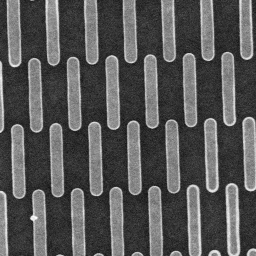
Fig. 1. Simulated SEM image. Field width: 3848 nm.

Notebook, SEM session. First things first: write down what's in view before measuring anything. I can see groups of lines, slits or small figures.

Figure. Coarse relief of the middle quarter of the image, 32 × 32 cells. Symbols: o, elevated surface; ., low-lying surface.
.ooo.......oo.......ooo.......oo
.ooo.......oo.......ooo.......oo
.ooo.......oo.......ooo.......oo
.ooo.......ooo......ooo.......oo
.ooo.......ooo......ooo.......oo
.ooo.......ooo......ooo.......oo
.ooo.......ooo......ooo.......oo
.ooo.......ooo......ooo.......oo
.ooo.......ooo......ooo.......oo
.ooo.......ooo......ooo.......oo
.ooo.......ooo......ooo.......oo
.ooo.......ooo.......oo.......oo
.ooo.......ooo.......oo.......oo
.ooo.......ooo.......ooo......oo
.ooo.......ooo...o...ooo..oo..oo
.ooo..ooo..ooo..ooo..oo..ooo...o
..o...ooo.......ooo......ooo....
......ooo.......ooo......ooo....
......ooo.......ooo.......ooo...
......ooo.......ooo.......ooo...
......ooo.......ooo.......ooo...
......ooo.......ooo.......ooo...
.......oo.......ooo.......ooo...
.......oo.......ooo.......ooo...
.......oo.......ooo.......ooo...
.......oo.......ooo.......ooo...
.......oo.......ooo.......ooo...
.......oo.......ooo.......ooo...
.......oo.......ooo.......ooo...
.......oo.......ooo.......ooo...
.......oo.......ooo.......ooo...
..oo...oo...oo..ooo..ooo..ooo..o